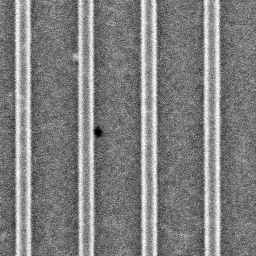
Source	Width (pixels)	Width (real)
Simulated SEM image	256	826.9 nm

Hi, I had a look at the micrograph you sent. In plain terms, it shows parallel lines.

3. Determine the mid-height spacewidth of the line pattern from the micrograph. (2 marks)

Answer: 158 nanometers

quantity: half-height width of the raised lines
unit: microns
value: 0.0441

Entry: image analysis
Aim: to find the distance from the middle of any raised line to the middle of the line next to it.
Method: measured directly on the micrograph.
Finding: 204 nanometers